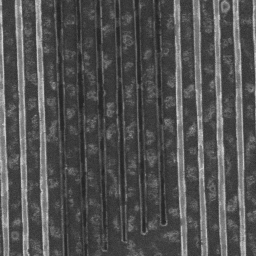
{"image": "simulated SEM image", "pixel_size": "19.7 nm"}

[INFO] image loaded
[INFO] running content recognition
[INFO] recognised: parallel lines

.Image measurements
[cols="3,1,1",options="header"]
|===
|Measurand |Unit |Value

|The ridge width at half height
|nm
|98.3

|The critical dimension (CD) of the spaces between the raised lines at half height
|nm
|290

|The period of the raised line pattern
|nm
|388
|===